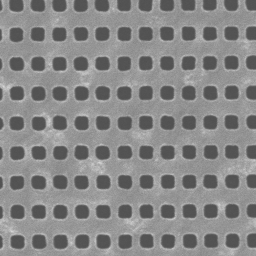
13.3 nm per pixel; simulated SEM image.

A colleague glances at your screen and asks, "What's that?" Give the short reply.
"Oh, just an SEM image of a regular array of holes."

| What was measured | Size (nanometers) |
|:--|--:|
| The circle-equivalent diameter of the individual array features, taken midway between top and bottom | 202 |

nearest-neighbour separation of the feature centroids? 284 nanometers